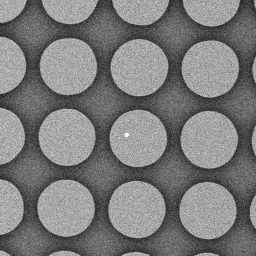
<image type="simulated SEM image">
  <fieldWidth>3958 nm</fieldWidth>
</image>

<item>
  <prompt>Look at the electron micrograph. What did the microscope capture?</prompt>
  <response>an array of small figures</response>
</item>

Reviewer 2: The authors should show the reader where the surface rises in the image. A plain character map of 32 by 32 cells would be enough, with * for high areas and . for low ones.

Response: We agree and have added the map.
***..*******..*******..*******..
***...*****....*****...******...
*......***......****....*****...
................................
................................
**....*****.....***......***....
***...******...*****...******...
***..*******..*******..*******..
***..*******..*******..*******..
***..*******..*******..*******..
**....*****....*****...******...
*......***......***.....****....
................................
................................
**....*****....****.....****....
***..******...******...******...
***..*******..*******..*******..
***..*******..*******..*******..
***..*******..*******..******...
**....*****....*****...******...
.......***......***.....****....
................................
................................
**....*****....****.....****....
***..******...******...******...
***..*******..*******..******..*
***..*******..*******.*******..*
***..******...******...******..*
**....*****...******...******...
........*.......**.......**.....
................................
*......**.......................